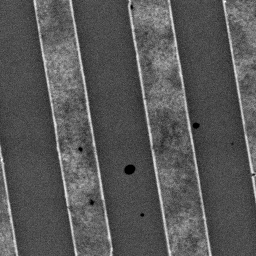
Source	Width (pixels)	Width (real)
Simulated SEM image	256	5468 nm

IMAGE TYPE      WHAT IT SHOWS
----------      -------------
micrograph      one or a few lines or trenches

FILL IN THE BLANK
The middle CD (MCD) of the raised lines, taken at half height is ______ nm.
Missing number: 823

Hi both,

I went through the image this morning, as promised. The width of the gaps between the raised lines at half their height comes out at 1.19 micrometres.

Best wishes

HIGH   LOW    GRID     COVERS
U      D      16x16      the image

DDUUUDDDUUUDDDUU
DDUUUDDDUUUDDDUU
DDDUUDDDUUUDDDUU
DDDUUDDDDUUDDDDU
DDDUUDDDDUUDDDDU
DDDUUDDDDUUDDDDU
DDDUUDDDDUUUDDDU
DDDUUUDDDUUUDDDU
DDDDUUDDDUUUDDDU
DDDDUUDDDDUUDDDD
DDDDUUDDDDUUDDDD
DDDDUUDDDDUUDDDD
UDDDUUDDDDUUUDDD
UDDDUUUDDDUUUDDD
UDDDDUUDDDUUUDDD
UDDDDUUDDDDUUDDD